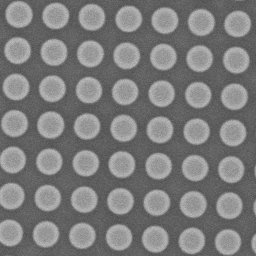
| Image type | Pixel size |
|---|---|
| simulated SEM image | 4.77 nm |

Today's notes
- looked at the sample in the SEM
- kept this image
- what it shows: an array of small figures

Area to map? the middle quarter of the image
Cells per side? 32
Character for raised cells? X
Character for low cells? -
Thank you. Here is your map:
-----XXX------XXXX-----XXXX----X
--------------------------------
--------------------------------
-----XX-------------------------
----XXXXX----XXXX------XXX------
---XXXXXX---XXXXXX----XXXXX----X
---XXXXXX---XXXXXX---XXXXXX----X
---XXXXXX---XXXXXX---XXXXXXX--XX
----XXXXX---XXXXXX---XXXXXX---XX
-----XX------XXXX-----XXXXX----X
-----------------------XX-------
--------------------------------
--------------------------------
---XXXXX-----XXXX------XX-------
---XXXXXX---XXXXXX---XXXXXX----X
---XXXXXX---XXXXXX---XXXXXX---XX
---XXXXXX---XXXXXX---XXXXXX---XX
---XXXXX----XXXXXX---XXXXXX---XX
----XXX------XXXX----XXXXXX---XX
-----------------------XX------X
--------------------------------
--------------------------------
---XXXXX-----XXX-------XX-------
---XXXXX----XXXXX----XXXXX-----X
--XXXXXXX--XXXXXXX---XXXXXX---XX
--XXXXXXX--XXXXXXX---XXXXXX---XX
---XXXXX----XXXXX----XXXXXX---XX
----XXX-----XXXXX----XXXXX----XX
----------------------XXX------X
--------------------------------
--------------------------------
---XXXX------XX-----------------